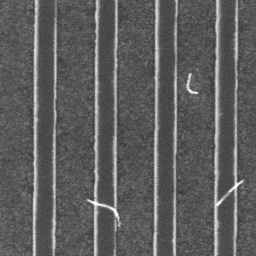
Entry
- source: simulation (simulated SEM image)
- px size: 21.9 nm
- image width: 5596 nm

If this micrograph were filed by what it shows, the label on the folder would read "lines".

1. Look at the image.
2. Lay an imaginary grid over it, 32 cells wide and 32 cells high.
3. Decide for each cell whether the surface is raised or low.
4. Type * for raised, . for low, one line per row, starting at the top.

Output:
....***.....***.....**.....***..
....***.....***.....**.....***..
....***.....***....***.....***..
....***.....***....***.....***..
....***.....***....***.....***..
....***.....***....***.....***..
....***.....**.....***.....***..
....***.....***....***.....***..
....***.....***....***.....**...
....***.....**.....***.....**...
....***.....**.....***.....***..
....***.....**.....***.....**...
....***.....**.....***.....**...
....***.....**.....***.....**...
....***.....**.....***.....**...
....***.....**.....***.....**...
....***.....**.....***.....**...
....***.....**.....***.....**...
....***.....**.....***.....**...
....***.....**.....***.....**...
....***.....**.....***.....**...
....***.....**.....***.....**...
....***.....**.....***.....***..
....***.....**.....***.....***..
....***.....**.....***.....**...
....***.....**.....***.....**...
....***.....***....***.....**...
....***.....**.....***.....**...
....***.....**.....***.....**...
....***.....**.....***.....**...
....***.....**.....***.....**...
....***.....**.....***.....**...